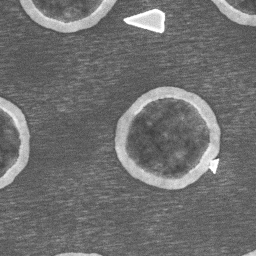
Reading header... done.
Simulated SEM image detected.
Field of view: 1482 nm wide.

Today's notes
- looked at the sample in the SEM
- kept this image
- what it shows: raised bodies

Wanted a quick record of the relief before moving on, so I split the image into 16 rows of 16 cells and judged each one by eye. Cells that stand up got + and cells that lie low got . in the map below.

..+++++.......++
...++...........
................
................
................
................
.........+++....
+.......+++++...
++......+++++...
++......+++++...
+.......+++++...
..........+.....
................
................
................
................